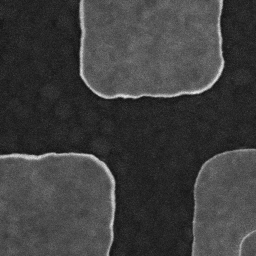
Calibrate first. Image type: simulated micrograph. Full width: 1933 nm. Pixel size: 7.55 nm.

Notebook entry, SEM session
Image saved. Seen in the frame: raised bodies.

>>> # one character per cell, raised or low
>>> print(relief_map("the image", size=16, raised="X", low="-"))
-----XXXXXXXXX--
-----XXXXXXXXX--
-----XXXXXXXXX--
-----XXXXXXXXX--
-----XXXXXXXXX--
------XXXXXXX---
----------------
----------------
----------------
----------------
XXXXXXX---------
XXXXXXX---------
XXXXXXX---------
XXXXXXX---------
XXXXXXX---------
XXXXXXX--------X